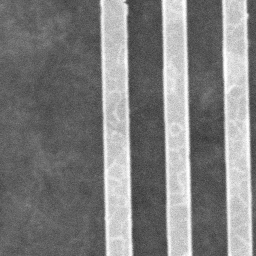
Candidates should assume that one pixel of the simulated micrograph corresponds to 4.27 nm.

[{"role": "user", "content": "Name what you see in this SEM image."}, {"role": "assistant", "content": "parallel lines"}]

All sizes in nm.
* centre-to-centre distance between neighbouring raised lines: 258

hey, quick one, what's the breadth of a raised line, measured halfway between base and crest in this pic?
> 0.0954 µm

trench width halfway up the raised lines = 163 nm